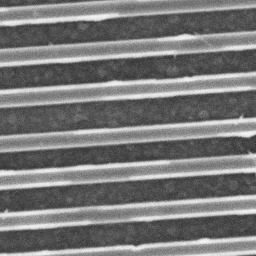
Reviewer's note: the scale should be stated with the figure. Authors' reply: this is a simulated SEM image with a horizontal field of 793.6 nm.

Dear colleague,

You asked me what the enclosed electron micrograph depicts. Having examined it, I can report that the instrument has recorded parallel lines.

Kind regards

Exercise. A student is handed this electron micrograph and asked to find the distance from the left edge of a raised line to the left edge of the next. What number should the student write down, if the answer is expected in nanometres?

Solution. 127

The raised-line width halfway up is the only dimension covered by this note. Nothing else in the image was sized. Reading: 51.8 nm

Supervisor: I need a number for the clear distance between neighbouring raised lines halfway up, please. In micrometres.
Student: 0.0735